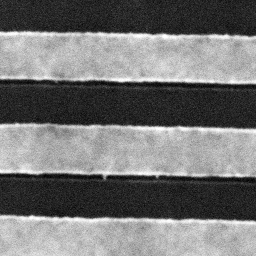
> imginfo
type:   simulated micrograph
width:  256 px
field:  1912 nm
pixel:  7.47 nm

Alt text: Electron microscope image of lines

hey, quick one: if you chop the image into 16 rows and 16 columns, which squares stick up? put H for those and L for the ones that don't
LLLLLLLLLLLLLLLL
LLLLLLLLLLLLLLLL
HHHHHHHHHHHHHHHH
HHHHHHHHHHHHHHHH
HHHHHHHHHHHHHHHH
LLLLLLLLLLLLLLLL
LLLLLLLLLLLLLLLL
LLLLLLLLLLLLLLLL
HHHHHHHHHHHHHHHH
HHHHHHHHHHHHHHHH
HHHHHHHHHHHHHHHH
LLLLLLLLLLLLLLLL
LLLLLLLLLLLLLLLL
HLLLLLLLLLLLLLLL
HHHHHHHHHHHHHHHH
HHHHHHHHHHHHHHHH